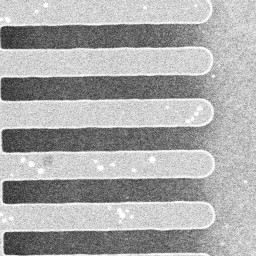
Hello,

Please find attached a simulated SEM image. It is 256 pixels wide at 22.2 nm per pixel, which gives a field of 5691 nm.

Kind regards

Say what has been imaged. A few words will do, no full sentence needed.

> groups of lines, slits or small figures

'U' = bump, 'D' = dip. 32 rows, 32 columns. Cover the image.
UUUUUUUUUUUUUUUUUUUUUUUUUUDDDDDD
UUUUUUUUUUUUUUUUUUUUUUUUUUDDDDDD
UUUUUUUUUUUUUUUUUUUUUUUUUUDDDDDD
DDDDDDDDDDDDDDDDDDDDDDDDDDDDDDDD
DDDDDDDDDDDDDDDDDDDDDDDDDDDDDDDD
DDDDDDDDDDDDDDDDDDDDDDDDDDDDDDDD
UUUUUUUUUUUUUUUUUUUUUUUUUUDDDDDD
UUUUUUUUUUUUUUUUUUUUUUUUUUDDDDDD
UUUUUUUUUUUUUUUUUUUUUUUUUUDDDDDD
UUUUUUUDDDDDDDDDDDDDDDDDDDDDDDDD
DDDDDDDDDDDDDDDDDDDDDDDDDDDDDDDD
DDDDDDDDDDDDDDDDDDDDDDDDDDDDDDDD
DDDDDDDDDDDDDDDDUUDUUUUUUUDDDDDD
UUUUUUUUUUUUUUUUUUUUUUUUUUUDDDDD
UUUUUUUUUUUUUUUUUUUUUUUUUUUDDDDD
UUUUUUUUUUUUUUUUUUUUUUUUUUDDDDDD
DDDDDDDDDDDDDDDDDDDDDDDDDDDDDDDD
DDDDDDDDDDDDDDDDDDDDDDDDDDDDDDDD
DDDDDDDDDDDDDDDDDDDDDDDDDDDDDDDD
UUUUUUUUUUUUUUUUUUUUUUUUUUDDDDDD
UUUUUUUUUUUUUUUUUUUUUUUUUUUDDDDD
UUUUUUUUUUUUUUUUUUUUUUUUUUDDDDDD
UDDDDDDDDDDDDDDDDDDDDDDDDDDDDDDD
DDDDDDDDDDDDDDDDDDDDDDDDDDDDDDDD
DDDDDDDDDDDDDDDDDDDDDDDDDDDDDDDD
UDDDDDDDUUUUUUUUUUUUUUUUUUDDDDDD
UUUUUUUUUUUUUUUUUUUUUUUUUUUDDDDD
UUUUUUUUUUUUUUUUUUUUUUUUUUUDDDDD
UUUUUUUUUUUUUUUUUUUUUUUUUDDDDDDD
DDDDDDDDDDDDDDDDDDDDDDDDDDDDDDDD
DDDDDDDDDDDDDDDDDDDDDDDDDDDDDDDD
DDDDDDDDDDDDDDDDDDDDDDDDDDDDDDDD